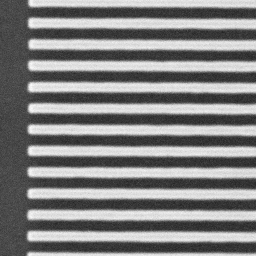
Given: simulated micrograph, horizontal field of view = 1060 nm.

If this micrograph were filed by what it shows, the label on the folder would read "groups of lines, slits or small figures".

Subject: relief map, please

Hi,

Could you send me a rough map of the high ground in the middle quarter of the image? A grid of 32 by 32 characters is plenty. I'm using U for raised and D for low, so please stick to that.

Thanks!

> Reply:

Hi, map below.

UUUUUUUUUUUUUUUUUUUUUUUUUUUUUUUU
DDDDDDDDDDDDDDDDDDDDDDDDDUUUUUUU
DDDDDDDDDDDDDDDDDDDDDDDDDDDDDDDD
DDDDDDDDDDDDDDDDDDDDDDDDDDDDDDDD
DDDDDDDDDDDDDDDDDDDDDDDDDDDDDDDD
UUUUUUUUUUUUUUUUUUUUUUUUUUUUUUUU
UUUUUUUUUUUUUUUUUUUUUUUUUUUUUUUU
DDDDDDDDDDDDDDDDDDDDDDDDDDDDDDDD
DDDDDDDDDDDDDDDDDDDDDDDDDDDDDDDD
DDDDDDDDDDDDDDDDDDDDDDDDDDDDDDDD
UUUUUUUUUUUUUUUUUUUUUUUUUUUUUUUU
UUUUUUUUUUUUUUUUUUUUUUUUUUUUUUUU
DDDDDDDDDDDDDDDDDDDDDDDDDDDDDDDD
DDDDDDDDDDDDDDDDDDDDDDDDDDDDDDDD
DDDDDDDDDDDDDDDDDDDDDDDDDDDDDDDD
UUUUUUUUUUUUDUUUDDUUUDDDDDDDDDDD
UUUUUUUUUUUUUUUUUUUUUUUUUUUUUUUU
DUUUUDDUUUUUUUUUUUUUUUUUUUUUUUUU
DDDDDDDDDDDDDDDDDDDDDDDDDDDDDDDD
DDDDDDDDDDDDDDDDDDDDDDDDDDDDDDDD
DDDDDDDDDDDDDDDDDDDDDDDDDDDDDDDD
UUUUUUUUUUUUUUUUUUUUUUUUUUUUUUUU
UUUUUUUUUUUUUUUUUUUUUUUUUUUUUUUU
DDDDDDDDDDDDDDDDDDDDDDDDDDDDDDDD
DDDDDDDDDDDDDDDDDDDDDDDDDDDDDDDD
DDDDDDDDDDDDDDDDDDDDDDDDDDDDDDDD
UUUUUUUUUUUUUUUUUUUUUUUUUUUUUUUU
UUUUUUUUUUUUUUUUUUUUUUUUUUUUUUUU
DDDDDDDDDDDDDDDDDDDDDDDDDDDDDDDD
DDDDDDDDDDDDDDDDDDDDDDDDDDDDDDDD
DDDDDDDDDDDDDDDDDDDDDDDDDDDDDDDD
UUUUUUUUUUUUUUUUUUUUUUUUUUUUUUUU